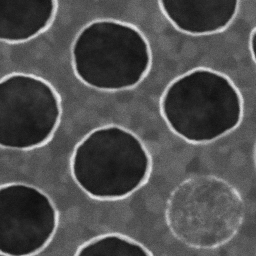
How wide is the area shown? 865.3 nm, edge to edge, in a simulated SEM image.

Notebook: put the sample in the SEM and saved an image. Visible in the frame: holes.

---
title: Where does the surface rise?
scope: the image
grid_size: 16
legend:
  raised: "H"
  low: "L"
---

LLLHHHHHHHLLLLLH
LLLHHHLLHHHLLLHH
LHHHHLLLLHHHHHHH
HHHHHLLLLHHHHHHH
HHHHHLLLLHHHLHHH
LLLHHHLLHHHLLLLH
LLLLHHHHHHLLLLLH
LLLLHHHHHHLLLLLH
LLLHHHLLHHHLLLHH
HHHHHLLLLHHHHHHH
HHHHHLLLLHHHHHHH
HHHHHLLLLHHHHHHH
LLLHHHHHHHHHHHHH
LLLHHHHHHHHHHHHH
LLLHHHHHHHHHHHHH
LLHHHLLLLHHHHHHH